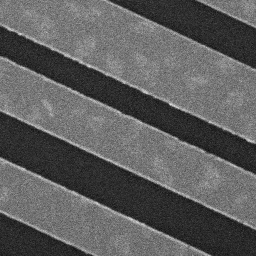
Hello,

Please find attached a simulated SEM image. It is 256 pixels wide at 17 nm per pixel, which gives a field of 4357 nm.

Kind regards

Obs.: one or a few lines or trenches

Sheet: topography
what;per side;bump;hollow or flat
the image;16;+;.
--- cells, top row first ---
++++++++.....+++
++++++++++......
..++++++++++....
....++++++++++..
++....++++++++++
++++.....+++++++
++++++.....+++++
.++++++++....+++
....+++++++....+
......+++++++...
+.......+++++++.
+++.......++++++
++++++......++++
.+++++++......++
...+++++++......
.....+++++++....